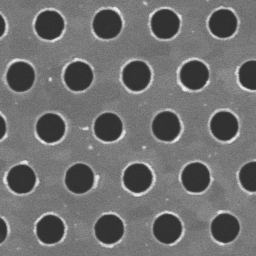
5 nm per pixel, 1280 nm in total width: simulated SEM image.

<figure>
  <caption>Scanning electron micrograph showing a regular array of holes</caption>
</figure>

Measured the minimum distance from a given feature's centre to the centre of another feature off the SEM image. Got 289 nanometers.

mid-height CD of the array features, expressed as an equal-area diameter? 143 nm